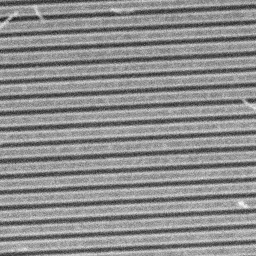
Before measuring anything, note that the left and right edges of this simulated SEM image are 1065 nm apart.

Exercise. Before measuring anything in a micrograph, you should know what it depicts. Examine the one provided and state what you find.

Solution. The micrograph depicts parallel lines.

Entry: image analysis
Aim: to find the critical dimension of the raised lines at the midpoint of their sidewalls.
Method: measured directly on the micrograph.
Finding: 35.9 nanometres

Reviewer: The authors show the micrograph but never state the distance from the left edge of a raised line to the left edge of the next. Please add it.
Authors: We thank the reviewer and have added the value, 15.7 pixels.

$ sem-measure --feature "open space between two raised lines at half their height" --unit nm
28.1